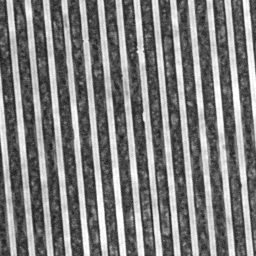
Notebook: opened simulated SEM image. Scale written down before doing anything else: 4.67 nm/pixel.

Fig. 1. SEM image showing parallel lines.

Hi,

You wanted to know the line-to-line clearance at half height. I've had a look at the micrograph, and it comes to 56.9 nanometres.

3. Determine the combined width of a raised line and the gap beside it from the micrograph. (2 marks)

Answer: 84.4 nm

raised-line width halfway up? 5.59 pixels